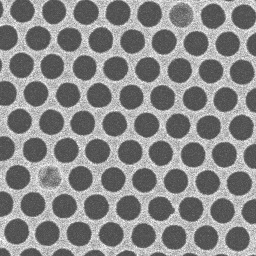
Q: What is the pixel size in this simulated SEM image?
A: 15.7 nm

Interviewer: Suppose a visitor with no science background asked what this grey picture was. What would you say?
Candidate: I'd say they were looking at a regular array of holes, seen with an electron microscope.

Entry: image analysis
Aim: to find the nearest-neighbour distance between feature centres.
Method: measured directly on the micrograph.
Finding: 488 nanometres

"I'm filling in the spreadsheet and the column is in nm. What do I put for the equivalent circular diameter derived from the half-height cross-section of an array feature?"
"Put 396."